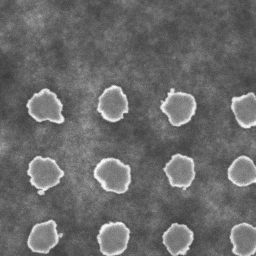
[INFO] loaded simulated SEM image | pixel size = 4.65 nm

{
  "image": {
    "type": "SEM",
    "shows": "raised bodies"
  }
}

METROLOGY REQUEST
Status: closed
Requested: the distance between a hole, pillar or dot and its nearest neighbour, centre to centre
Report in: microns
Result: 0.3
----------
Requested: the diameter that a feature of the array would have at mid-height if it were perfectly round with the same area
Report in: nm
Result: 150